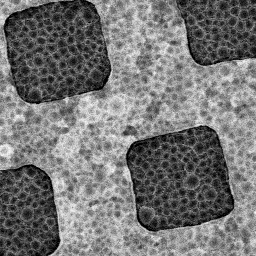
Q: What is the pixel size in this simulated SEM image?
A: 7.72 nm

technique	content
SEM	holes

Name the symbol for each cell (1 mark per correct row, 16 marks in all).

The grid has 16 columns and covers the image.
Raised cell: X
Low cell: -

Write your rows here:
XX----XXXXX-----
------XXXXXX----
-------XXXXX----
-------XXXXX----
X------XXXXXXXXX
X-----XXXXXXXXXX
XXXXXXXXXXXXXXXX
XXXXXXXXXXXXXXXX
XXXXXXXXXX----XX
XXXXXXXX------XX
X-XXXXXX------XX
---XXXXX------XX
---XXXXX-------X
----XXXXX-----XX
----XXXXXXXXXXXX
----XXXXXXXXXXXX